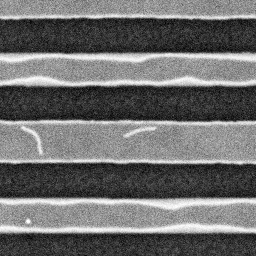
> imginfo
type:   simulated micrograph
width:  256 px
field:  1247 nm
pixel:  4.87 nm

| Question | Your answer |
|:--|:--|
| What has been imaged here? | lines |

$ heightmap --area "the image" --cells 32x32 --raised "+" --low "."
++++++++++++++++++++++++++++++++
++++++++++++++++++++++++++++++++
................................
................................
................................
................................
................................
++++++++++++++++++++++++++++++++
++++++++++++++++++++++++++++++++
++++++++++++++++++++++++++++++++
++.....++++++++.++++++...+++++++
................................
................................
................................
................................
++++++++++++++++++++++++++++++++
++++++++++++++++++++++++++++++++
++++++++++++++++++++++++++++++++
++++++++++++++++++++++++++++++++
++++++++++++++++++++++++++++++++
................................
................................
................................
................................
................................
++++++++++++++++++++++++++++++++
++++++++++++++++++++++++++++++++
++++++++++++++++++++++++++++++++
++++++++++++++++++++++++++++++++
................................
................................
................................